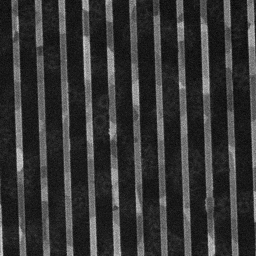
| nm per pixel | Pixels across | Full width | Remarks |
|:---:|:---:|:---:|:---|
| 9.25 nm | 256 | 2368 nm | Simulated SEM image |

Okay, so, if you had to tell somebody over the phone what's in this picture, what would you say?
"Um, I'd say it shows parallel lines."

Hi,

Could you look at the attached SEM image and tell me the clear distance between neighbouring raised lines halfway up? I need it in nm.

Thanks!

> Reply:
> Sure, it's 164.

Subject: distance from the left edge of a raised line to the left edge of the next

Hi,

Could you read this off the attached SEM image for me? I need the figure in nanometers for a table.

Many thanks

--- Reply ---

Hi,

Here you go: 218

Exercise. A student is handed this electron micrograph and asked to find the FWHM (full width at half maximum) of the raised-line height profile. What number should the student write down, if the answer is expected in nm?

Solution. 50.8